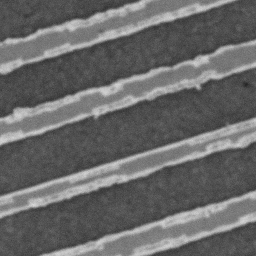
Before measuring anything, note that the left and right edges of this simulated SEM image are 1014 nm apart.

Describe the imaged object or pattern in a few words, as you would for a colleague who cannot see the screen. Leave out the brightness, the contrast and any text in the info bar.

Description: one or a few lines or trenches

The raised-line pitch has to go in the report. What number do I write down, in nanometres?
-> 286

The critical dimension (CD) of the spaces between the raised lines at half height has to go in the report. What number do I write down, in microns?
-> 0.203